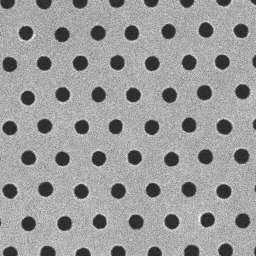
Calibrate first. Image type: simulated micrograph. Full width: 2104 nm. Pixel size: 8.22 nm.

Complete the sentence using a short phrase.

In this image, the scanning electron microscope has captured a regular array of holes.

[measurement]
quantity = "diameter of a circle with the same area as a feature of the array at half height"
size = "15.1 px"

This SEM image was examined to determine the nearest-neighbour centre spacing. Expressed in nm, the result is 283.